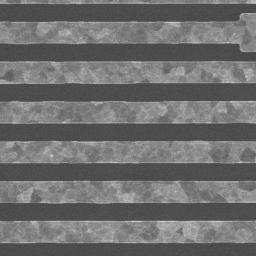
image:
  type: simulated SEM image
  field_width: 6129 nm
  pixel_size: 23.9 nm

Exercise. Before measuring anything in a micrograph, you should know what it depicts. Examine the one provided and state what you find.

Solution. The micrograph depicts wiring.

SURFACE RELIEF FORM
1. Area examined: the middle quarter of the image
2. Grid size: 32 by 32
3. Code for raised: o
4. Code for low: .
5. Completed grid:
oooooooooooooooooooooooooooooooo
oooooooooooooooooooooooooooooooo
oooooooooooooooooooooooooooooooo
oooooooooooooooooooooooooooooooo
oooooooooooooooooooooooooooooooo
................................
................................
................................
................................
................................
oooooooooooooooooooooooooooooooo
oooooooooooooooooooooooooooooooo
oooooooooooooooooooooooooooooooo
oooooooooooooooooooooooooooooooo
oooooooooooooooooooooooooooooooo
................................
................................
................................
................................
oooo.....ooooooooooooooooooooooo
oooooooooooooooooooooooooooooooo
oooooooooooooooooooooooooooooooo
oooooooooooooooooooooooooooooooo
oooooooooooooooooooooooooooooooo
.oooooo......oooooo.............
................................
................................
................................
................................
..ooooo....oooooooooooooo...oooo
oooooooooooooooooooooooooooooooo
oooooooooooooooooooooooooooooooo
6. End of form